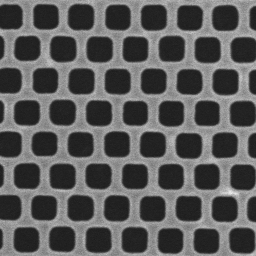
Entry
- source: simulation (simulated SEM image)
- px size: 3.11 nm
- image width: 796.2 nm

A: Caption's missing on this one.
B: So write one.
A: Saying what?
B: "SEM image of a regular array of holes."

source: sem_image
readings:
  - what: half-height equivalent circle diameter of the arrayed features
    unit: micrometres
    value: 0.0872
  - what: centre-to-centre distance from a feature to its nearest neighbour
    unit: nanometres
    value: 112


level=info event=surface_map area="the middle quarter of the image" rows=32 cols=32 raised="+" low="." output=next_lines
++++++++++++++++++++++++++++++++
++.....++++.....++++.....++++...
+.......++.......++.......++....
+.......++.......++.......++....
+.......++.......++.......++....
+.......++.......++.......++....
+......+++......+++......+++....
++....++++++...+++++....+++++...
++++++++++++++++++++++++++++++++
..++++.....++++.....+++++....+++
...++.......+++......+++......++
...++.......+++......++.......++
...++.......+++......++.......++
...++.......++.......++.......++
...+++......+++......+++......++
+++++++...++++++...++++++....+++
++++++++++++++++++++++++++++++++
+......+++......++++.....++++...
+......+++......+++......+++....
+......+++.......++.......++....
+.......++.......++.......++....
+......+++.......++.......++....
+......+++......+++......+++....
++++++++++++++++++++....+++++...
++++++++++++++++++++++++++++++++
..++++......+++.....++++.....+++
...++.......+++......+++......++
...++.......++.......++.......++
...++.......++.......++.......++
...++.......++.......++.......++
...+++.....++++......+++......++
+++++++++++++++++..++++++...++++